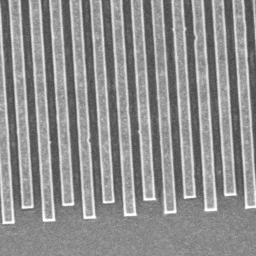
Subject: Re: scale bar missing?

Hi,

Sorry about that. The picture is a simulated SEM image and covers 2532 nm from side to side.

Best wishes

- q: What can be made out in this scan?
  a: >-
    parallel lines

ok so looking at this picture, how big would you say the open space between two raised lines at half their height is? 90 nanometres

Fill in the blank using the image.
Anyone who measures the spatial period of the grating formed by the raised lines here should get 201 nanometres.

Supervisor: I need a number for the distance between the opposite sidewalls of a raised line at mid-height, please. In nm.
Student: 107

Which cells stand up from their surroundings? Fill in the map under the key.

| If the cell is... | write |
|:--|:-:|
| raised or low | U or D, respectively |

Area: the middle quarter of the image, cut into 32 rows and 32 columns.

DDDUUDDDUUDDDUUDDDUUUDDUUUDDUUUD
DDDUUDDDUUDDDUUDDDUUUDDUUUDDUUUD
DDDUUDDDUUDDDUUDDDUUUDDUUUDDUUUD
DDDUUDDDUUUDDUUUDDUUUDDUUUDDUUUD
DDDUUDDDUUUDDUUUDDUUUDDUUUDDUUUD
DDDUUDDDUUDDDUUUDDUUUDDUUUDDUUUD
UDDUUUDDUUUDDUUUDDUUUDDUUUDDUUUD
UDDUUUDDUUUDDUUUDDUUUDDUUUDDUUUD
UDDUUUDDUUUDDUUUDDUUUDDDUUDDDUUD
UDDUUUDDUUUDDUUUDDUUUDDDUUDDDUUD
UDDUUUDDUUUDDUUUDDDUUDDDUUDDDUUD
UDDUUUDDUUUDDDUUDDDUUDDDUUDDDUUD
UDDUUUDDUUUDDDUUDDDUUDDDUUDDDUUD
UDDUUUDDUUUDDDUUDDDUUDDDUUDDDUUD
UDDDUUDDDUUDDDUUDDDUUDDDUUDDDUUD
UDDDUUDDDUUDDDUUDDDUUUDDUUDDDUUD
UDDDUUDDDUUDDDUUDDDUUUDDUUUDDUUU
UDDDUUDDDUUDDDUUDDDUUUDDUUUDDUUU
UDDDUUDDDUUDDDUUDDDUUUDDUUUDDUUU
UDDDUUDDDUUDDDUUUDDUUUDDUUUDDUUU
UDDDUUDDDUUDDDUUUDDUUUDDUUUDDUUU
UUDDUUDDDUUDDDUUUDDUUUDDUUUDDUUU
UUDDUUUDDUUUDDUUUDDUUUDDUUUDDUUU
UUDDUUUDDUUUDDUUUDDDUUDDUUUDDUUU
UUDDUUUDDUUUDDUUUDDDUUDDDUUDDDUU
UUDDUUUDDUUUDDUUUDDDUUDDDUUDDDUU
UUDDUUUDDUUUDDUUUDDUUUDDDUUDDDUU
UUDDUUUDDUUUDDDUUDDDUUDDDUUDDDUU
UUDDUUUDDUUUDDDUUDDDUUDDDUUDDDUU
UUDDUUUDDUUUDDDUUDDDUUDDDUUDDDUU
UUDDDUUDDDUUDDDUUDDDUUDDDUUDDDUU
UUDDDUUDDDUUDDDUUDDDUUUDDUUUDDUU